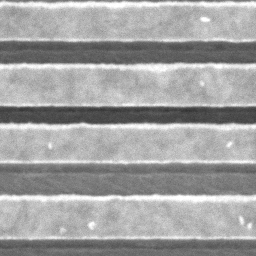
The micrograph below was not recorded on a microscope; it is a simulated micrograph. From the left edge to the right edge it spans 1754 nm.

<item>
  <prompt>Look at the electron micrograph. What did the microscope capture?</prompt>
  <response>lines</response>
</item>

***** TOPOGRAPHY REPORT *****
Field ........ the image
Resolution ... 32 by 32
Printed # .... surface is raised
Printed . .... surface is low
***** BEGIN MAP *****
################################
################################
################################
################################
################################
................................
................................
................................
################################
################################
################################
################################
################################
................................
................................
######..####..################..
################################
################################
################################
################################
................................
................................
................................
................................
#......###.........#..#.........
################################
################################
################################
################################
################################
................................
................................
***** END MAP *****